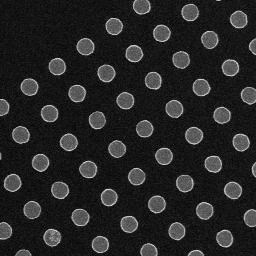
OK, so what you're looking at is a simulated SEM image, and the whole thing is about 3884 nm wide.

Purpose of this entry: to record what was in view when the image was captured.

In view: a regular array of raised bodies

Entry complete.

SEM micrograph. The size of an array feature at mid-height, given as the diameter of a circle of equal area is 257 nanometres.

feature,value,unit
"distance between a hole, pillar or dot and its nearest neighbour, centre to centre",508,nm